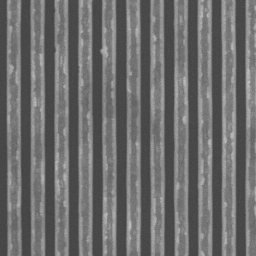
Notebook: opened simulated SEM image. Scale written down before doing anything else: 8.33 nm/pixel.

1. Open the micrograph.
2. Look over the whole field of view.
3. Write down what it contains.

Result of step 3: parallel lines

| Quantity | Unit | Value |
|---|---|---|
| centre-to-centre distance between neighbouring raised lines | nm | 199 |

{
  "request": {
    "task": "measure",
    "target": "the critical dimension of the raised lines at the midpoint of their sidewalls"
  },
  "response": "11.2 px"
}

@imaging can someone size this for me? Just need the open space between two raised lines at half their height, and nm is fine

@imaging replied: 102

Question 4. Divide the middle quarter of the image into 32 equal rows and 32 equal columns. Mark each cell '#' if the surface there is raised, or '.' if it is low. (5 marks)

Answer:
#...###...##....###...###...##..
#...###...##....###...###...##..
#...###...##....###...###...##..
#...###...##....###...###...##..
#...###...##....###...###...##..
#...###...##....###...###...##..
#...###...##....###...###...##..
#...###...##....###...###...##..
#...###...##....###...###...##..
#...###...##....###...###...###.
#...###...###...###...###...###.
#...###...###...###...###...###.
#...###...###...###...###...###.
#...###...###...###...###...###.
#...###...###...###...###...###.
#...###...###...###...###...###.
#...###...###...###...###...###.
#...###...###...###...###...###.
#...###...###...###...###...###.
#...###...###...###...###...###.
#...###...###...###...###...###.
#...###...###...###...###...###.
#...###...###...###...###...###.
#...###...###...###...###...###.
#...###...###...###...###...###.
#...###...###...###...###...###.
#...###...###...###...###...###.
#...###...###...###...###...###.
#...###...###...###...###...###.
#...###...###...###...###...###.
#...###...###...###...###...##..
#...###...###...###...###...##..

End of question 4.